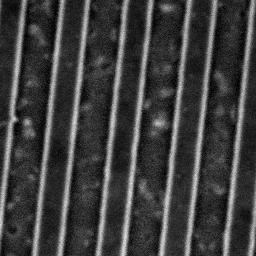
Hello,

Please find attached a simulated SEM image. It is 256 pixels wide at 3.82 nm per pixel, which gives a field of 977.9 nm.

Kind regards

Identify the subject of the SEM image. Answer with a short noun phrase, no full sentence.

one or a few lines or trenches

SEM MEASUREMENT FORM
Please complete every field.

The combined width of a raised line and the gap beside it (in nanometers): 241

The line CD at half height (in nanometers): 97.7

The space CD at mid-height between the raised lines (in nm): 145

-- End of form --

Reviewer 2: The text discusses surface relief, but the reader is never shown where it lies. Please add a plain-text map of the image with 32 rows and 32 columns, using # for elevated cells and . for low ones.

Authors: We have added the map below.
###.....###.....###.....###.....
###.....###.....###.....###....#
###.....###.....###....####....#
###....####....####....####....#
###....####....###.....###.....#
##.....###.....###.....###.....#
##.....###.....###.....###.....#
##.....###.....###.....###.....#
##.....###.....###.....###.....#
##.....###.....###.....###.....#
##.....###.....###.....###....##
##.....###....####....####....##
##....####....####....####....##
##....####....###.....###.....##
##....###.....###.....###.....##
#.....###.....###.....###.....##
#.....###.....###.....###.....##
#.....###.....###.....###.....##
#.....###.....###.....###.....##
#.....###.....###.....###.....##
#.....###.....###....####....###
#....####....####....####....###
#....####....###.....###.....###
.....###.....###.....###.....###
.....###.....###.....###.....###
.....###.....###.....###.....###
.....###.....###.....###.....###
.....###.....###.....###.....###
.....###.....###.....###....####
.....###.....###....####....####
....####....####....####....####
....####....###.....###.....###.